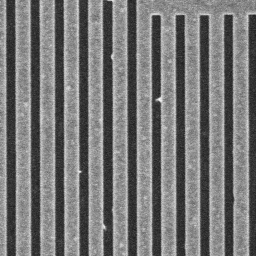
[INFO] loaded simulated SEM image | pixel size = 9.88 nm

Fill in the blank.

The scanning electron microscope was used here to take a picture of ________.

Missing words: parallel lines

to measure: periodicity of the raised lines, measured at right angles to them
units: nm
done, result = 239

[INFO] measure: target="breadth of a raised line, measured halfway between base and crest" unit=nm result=143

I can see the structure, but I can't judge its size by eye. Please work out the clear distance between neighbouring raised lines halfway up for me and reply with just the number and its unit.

101 nanometres